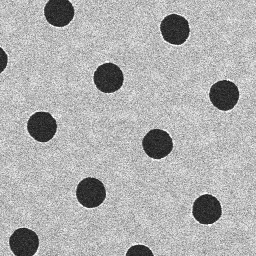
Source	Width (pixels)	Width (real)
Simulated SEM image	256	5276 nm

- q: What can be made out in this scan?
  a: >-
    holes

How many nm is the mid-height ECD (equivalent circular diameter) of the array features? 626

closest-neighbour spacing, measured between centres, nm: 1690